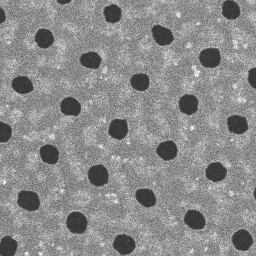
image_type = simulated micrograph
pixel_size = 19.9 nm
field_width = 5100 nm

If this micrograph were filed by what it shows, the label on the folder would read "a regular array of holes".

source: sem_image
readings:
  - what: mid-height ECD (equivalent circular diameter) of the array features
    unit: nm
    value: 414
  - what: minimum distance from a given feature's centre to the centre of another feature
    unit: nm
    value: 1030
